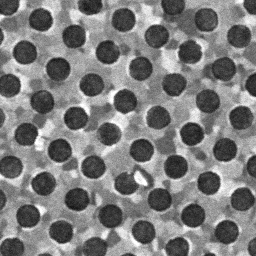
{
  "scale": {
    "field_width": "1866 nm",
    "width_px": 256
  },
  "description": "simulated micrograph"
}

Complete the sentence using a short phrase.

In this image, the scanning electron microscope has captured a regular array of holes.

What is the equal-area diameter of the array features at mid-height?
182 nm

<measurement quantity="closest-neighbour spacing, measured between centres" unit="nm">264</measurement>